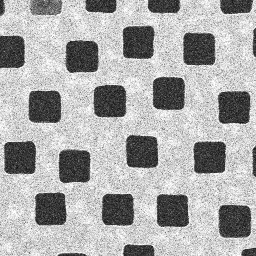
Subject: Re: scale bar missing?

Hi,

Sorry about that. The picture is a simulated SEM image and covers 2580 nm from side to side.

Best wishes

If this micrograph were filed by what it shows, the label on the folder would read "a regular array of holes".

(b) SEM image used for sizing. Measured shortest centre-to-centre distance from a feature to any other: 554 nm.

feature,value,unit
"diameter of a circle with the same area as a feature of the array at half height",357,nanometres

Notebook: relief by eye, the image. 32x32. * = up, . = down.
.***....***....***....*****.....
.***....****..*****...******...*
********************************
****************...*************
..*************....****....*****
...*****....***....****....*****
...*****....***....****....*****
...*****....***********....*****
..******....********************
********************************
*******************....*********
****...*****....***....*****...*
****....****....***....****....*
***.....****....****...****....*
****....****...************....*
********************************
********************************
****************....************
*...************....****....****
....***....*****....****....****
*...***....*****....****....****
*...***....**************...****
********...*********************
********************************
*****...*****...****...*********
****....*****....***....********
****....*****....***....***....*
****....*****....***....***....*
***************************....*
****************************...*
********************************
***************....***********..